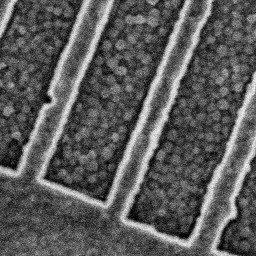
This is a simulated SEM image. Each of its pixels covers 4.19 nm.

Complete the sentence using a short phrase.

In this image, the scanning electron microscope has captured one or a few lines or trenches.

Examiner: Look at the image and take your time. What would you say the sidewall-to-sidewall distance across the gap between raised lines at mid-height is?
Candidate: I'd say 290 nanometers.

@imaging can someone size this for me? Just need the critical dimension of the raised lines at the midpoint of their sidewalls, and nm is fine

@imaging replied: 99.2